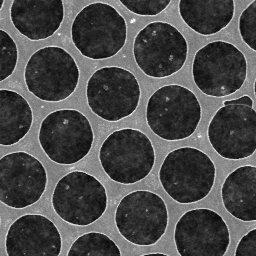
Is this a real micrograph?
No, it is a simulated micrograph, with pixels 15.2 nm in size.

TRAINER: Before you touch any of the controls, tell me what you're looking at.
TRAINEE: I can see a regular array of holes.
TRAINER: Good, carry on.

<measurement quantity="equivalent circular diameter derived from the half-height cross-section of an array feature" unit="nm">821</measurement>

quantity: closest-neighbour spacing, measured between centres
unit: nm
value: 961